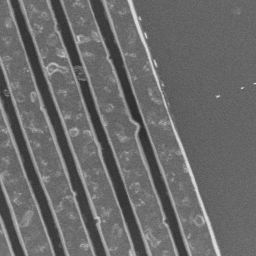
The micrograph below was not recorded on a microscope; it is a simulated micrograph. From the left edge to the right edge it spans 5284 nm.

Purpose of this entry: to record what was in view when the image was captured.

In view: parallel lines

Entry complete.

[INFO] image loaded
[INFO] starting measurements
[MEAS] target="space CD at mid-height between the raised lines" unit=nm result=246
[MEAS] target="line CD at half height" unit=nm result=568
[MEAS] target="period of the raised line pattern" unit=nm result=802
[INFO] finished